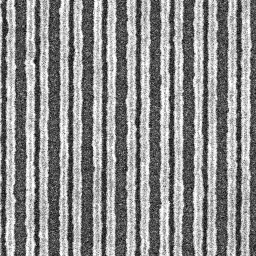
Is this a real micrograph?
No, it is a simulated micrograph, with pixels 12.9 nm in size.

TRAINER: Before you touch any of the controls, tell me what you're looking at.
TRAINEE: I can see parallel lines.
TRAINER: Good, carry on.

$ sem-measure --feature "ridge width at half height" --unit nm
86.9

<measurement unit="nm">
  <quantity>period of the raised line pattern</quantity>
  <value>216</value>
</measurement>